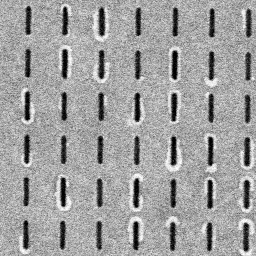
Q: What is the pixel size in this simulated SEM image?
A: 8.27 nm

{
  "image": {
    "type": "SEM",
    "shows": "a regular array of holes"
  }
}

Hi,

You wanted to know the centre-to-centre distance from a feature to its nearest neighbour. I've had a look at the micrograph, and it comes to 303 nm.